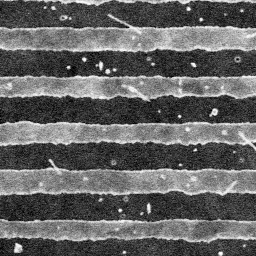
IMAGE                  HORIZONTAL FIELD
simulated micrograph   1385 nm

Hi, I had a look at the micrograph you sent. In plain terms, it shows lines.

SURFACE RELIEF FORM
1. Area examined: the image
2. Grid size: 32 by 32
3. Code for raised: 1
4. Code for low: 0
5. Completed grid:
00000000000100000000000000000000
00000000000000000000000000000000
00000000000000000000000000000000
10001111101111111111111111111101
11111111111111111111111111111111
11111111111111111111111111111111
00000000000000000000000000000000
00000000000000000000000000000000
00000000000000000000000000000000
00000000000000000000000000000000
11111111111111111111111111111111
11111111111111111111111111111111
00000000000000000000000000000000
00000000000000000000000000000000
00000000000000000000000000000000
11111111111000000111111111111111
11111111111111111111111111111111
11111111111111111111111111111111
00000000000000000000000000000000
00000000000000000000000000000000
00000000000000000000000000000000
11111111111111111111111111111111
11111111111111111111111111111111
11111111111111111111111111111111
00000000000000000000000000000000
00000000000000000000000000000000
00000000000000000000000000000000
10000000000000000000011110010000
11111111111111111111111111111111
11111111111111111111111111111111
00000000000000000000000000000000
00000000000000000000000000000000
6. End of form